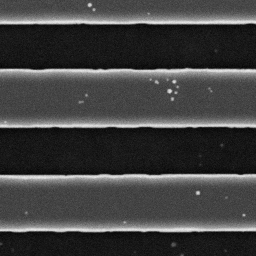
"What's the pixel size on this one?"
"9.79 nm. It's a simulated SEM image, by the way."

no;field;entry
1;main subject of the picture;lines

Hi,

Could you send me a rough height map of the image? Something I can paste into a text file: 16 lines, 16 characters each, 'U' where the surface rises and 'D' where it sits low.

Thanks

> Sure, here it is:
UUUUUUUUUUUUUUUU
DDDDDDDDDDDDDDDD
DDDDDDDDDDDDDDDD
DDDDDDDDDDDDDDDD
UUUUUUUUUUUUUUUU
UUUUUUUUUUUUUUUU
UUUUUUUUUUUUUUUU
UUUUUUUUUUUUUUUU
DDDDDDDDDDDDDDDD
DDDDDDDDDDDDDDDD
DDDDDDDDDDDDDDDD
UUUUUUUUUUUUUUUU
UUUUUUUUUUUUUUUU
UUUUUUUUUUUUUUUU
DDDDDDDDDDDDDDDD
DDDDDDDDDDDDDDDD